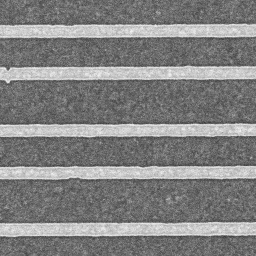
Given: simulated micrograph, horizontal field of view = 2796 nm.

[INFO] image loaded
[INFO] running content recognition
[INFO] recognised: parallel lines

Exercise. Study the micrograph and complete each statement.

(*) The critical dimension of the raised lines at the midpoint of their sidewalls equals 130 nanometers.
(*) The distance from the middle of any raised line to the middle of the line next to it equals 542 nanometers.